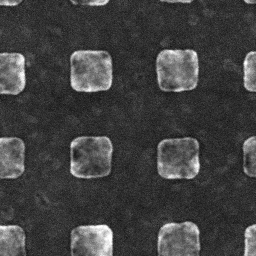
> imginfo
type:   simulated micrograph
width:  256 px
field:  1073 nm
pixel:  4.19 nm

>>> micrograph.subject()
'raised bodies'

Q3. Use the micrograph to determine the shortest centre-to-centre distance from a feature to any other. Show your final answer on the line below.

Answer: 360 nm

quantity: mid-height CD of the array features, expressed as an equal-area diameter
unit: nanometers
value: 182